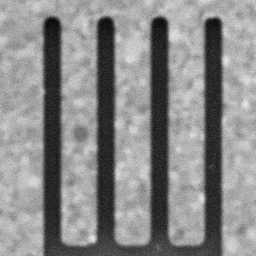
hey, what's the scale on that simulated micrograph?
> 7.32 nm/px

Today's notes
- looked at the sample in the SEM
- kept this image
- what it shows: groups of lines, slits or small figures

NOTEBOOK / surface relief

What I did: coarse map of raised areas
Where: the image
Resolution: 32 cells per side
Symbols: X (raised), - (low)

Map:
XXXXXXXXXXXXXXXXXXXXXXXXXXXXXXXX
XXXXXXXXXXXXXXXXXXXXXXXXXXXXXXXX
XXXXXX-XXXXX--XXXXX--XXXXX--XXXX
XXXXX---XXXX--XXXXX--XXXX---XXXX
XXXXX---XXXX--XXXXX--XXXX---XXXX
XXXXX---XXXX--XXXXX--XXXX---XXXX
XXXXX---XXXX--XXXXX--XXXX---XXXX
XXXXX---XXXX--XXXXX--XXXX---XXXX
XXXXX---XXXX--XXXXX--XXXX---XXXX
XXXXX---XXXX--XXXXX--XXXX---XXXX
XXXXX---XXXX--XXXXX--XXXX---XXXX
XXXXX---XXXX--XXXXX--XXXX---XXXX
XXXXX---XXXX--XXXXX--XXXX---XXXX
XXXXX---XXXX--XXXXX--XXXX---XXXX
XXXXX---XXXX--XXXXX--XXXX---XXXX
XXXXX---XXXX--XXXXX--XXXX---XXXX
XXXXX---XXXX--XXXXX--XXXX---XXXX
XXXXX---XXXX--XXXXX--XXXX---XXXX
XXXXX---XXXX--XXXXX--XXXX---XXXX
XXXXX---XXXX--XXXXX--XXXX---XXXX
XXXXX---XXXX--XXXXX--XXXX---XXXX
XXXXX---XXXX--XXXXX--XXXX---XXXX
XXXXX---XXXX--XXXXX--XXXX---XXXX
XXXXX---XXXX--XXXXX--XXXX---XXXX
XXXXX---XXXX--XXXXX--XXXX---XXXX
XXXXX---XXXX--XXXXX--XXXX---XXXX
XXXXX---XXXX--XXXXX--XXXX---XXXX
XXXXX---XXXX--XXXXX--XXXX---XXXX
XXXXX---XXXX--XXXXX--XXXX---XXXX
XXXXX---XXXX--XXXXX--XXXX---XXXX
XXXXX---XXX----XXX----XXX---XXXX
XXXXX-----------------------XXXX